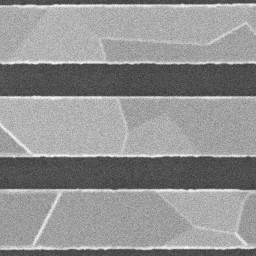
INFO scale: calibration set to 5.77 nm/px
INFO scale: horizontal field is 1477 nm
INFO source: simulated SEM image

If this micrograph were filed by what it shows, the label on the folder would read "lines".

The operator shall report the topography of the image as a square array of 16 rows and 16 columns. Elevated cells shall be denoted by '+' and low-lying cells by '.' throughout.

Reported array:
++++++++++++++++
++++++++++++++++
++++++++++++++++
++++++++++++++++
................
................
++++++++++++++++
++++++++++++++++
++++++++++++++++
++++++++++++++++
................
................
++++++++++++++++
++++++++++++++++
++++++++++++++++
++++++++++++++++